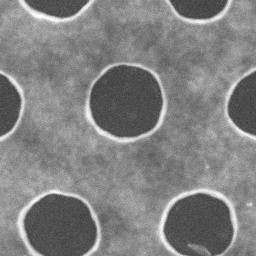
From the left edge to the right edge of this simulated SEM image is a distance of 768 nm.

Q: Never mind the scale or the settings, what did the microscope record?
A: holes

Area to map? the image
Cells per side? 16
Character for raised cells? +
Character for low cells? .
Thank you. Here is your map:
++...++++++...++
++++++++++++++++
++++++++++++++++
++++++++++++++++
+++++++..+++++++
.+++++....+++++.
.+++++....++++..
.+++++....++++..
+++++++..+++++++
++++++++++++++++
++++++++++++++++
++++++++++++++++
++...++++++...++
+.....++++.....+
+.....++++.....+
++....+++++...++